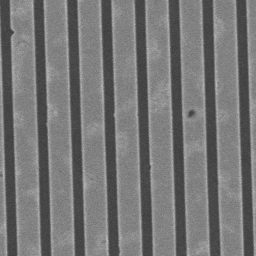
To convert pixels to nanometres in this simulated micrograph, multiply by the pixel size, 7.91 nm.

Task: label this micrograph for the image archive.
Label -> parallel lines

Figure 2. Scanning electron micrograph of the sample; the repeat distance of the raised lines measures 267 nanometres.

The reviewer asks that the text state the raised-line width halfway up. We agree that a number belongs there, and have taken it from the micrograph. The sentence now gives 22.9 px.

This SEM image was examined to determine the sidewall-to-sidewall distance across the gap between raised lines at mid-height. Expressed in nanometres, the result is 86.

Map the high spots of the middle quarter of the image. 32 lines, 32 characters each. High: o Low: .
o...oooooo..oooooo...ooooo....oo
o...oooooo...ooooo...ooooo...ooo
o...oooooo...ooooo...ooooo...ooo
o...oooooo...ooooo...oooooo..ooo
o...oooooo...ooooo...oooooo...oo
o...oooooo...ooooo...oooooo...oo
o...oooooo...ooooo...oooooo...oo
o...oooooo...ooooo...oooooo...oo
o...oooooo...ooooo...oooooo...oo
o...oooooo...ooooo...oooooo...oo
o...oooooo...ooooo...oooooo...oo
o...oooooo...ooooo...oooooo...o.
o...oooooo...ooooo...oooooo...o.
o...oooooo...ooooo...oooooo...o.
oo..oooooo...ooooo...oooooo...oo
oo..oooooo...ooooo...oooooo...oo
oo...ooooo...ooooo...oooooo...oo
oo...ooooo...ooooo...oooooo...oo
oo...ooooo...oooooo..oooooo...oo
oo...ooooo...oooooo...ooooo...oo
oo...ooooo...oooooo...ooooo...oo
oo...ooooo...oooooo...ooooo...oo
oo...ooooo...oooooo...ooooo...oo
oo...ooooo...oooooo...ooooo...oo
oo...ooooo...oooooo...ooooo...oo
oo...ooooo...oooooo...ooooo...oo
oo...ooooo...oooooo...ooooo...oo
oo...ooooo...oooooo...ooooo...oo
oo...o.ooo...oooooo...ooooo...oo
oo...ooooo...oooooo...ooooo...oo
oo...ooooo...oooooo...ooooo...oo
oo...ooooo...oooooo...ooooo...oo